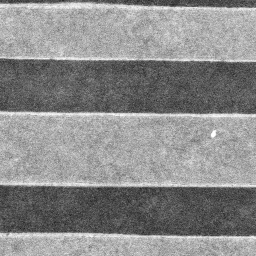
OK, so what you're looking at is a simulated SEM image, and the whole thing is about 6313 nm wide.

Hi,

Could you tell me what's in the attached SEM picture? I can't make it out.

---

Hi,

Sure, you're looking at lines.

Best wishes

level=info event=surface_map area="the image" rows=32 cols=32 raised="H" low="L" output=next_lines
LLLLLLLLLLLLLLLLLLLLLLLLLLLLLLLL
HHHHHHHHHHHHHHHHHHHHHHHHHHHHHHHH
HHHHHHHHHHHHHHHHHHHHHHHHHHHHHHHH
HHHHHHHHHHHHHHHHHHHHHHHHHHHHHHHH
HHHHHHHHHHHHHHHHHHHHHHHHHHHHHHHH
HHHHHHHHHHHHHHHHHHHHHHHHHHHHHHHH
HHHHHHHHHHHHHHHHHHHHHHHHHHHHHHHH
LLLLLLLLLLLLLLLLLLLLLLLLLLHHHHHH
LLLLLLLLLLLLLLLLLLLLLLLLLLLLLLLL
LLLLLLLLLLLLLLLLLLLLLLLLLLLLLLLL
LLLLLLLLLLLLLLLLLLLLLLLLLLLLLLLL
LLLLLLLLLLLLLLLLLLLLLLLLLLLLLLLL
LLLLLLLLLLLLLLLLLLLLLLLLLLLLLLLL
LLLLLLLLLLLLLLLLLLLLLLLLLLLLLLLL
HHHHHHHHHHHHHHHHHLLLLLLLLLLLLLLL
HHHHHHHHHHHHHHHHHHHHHHHHHHHHHHHH
HHHHHHHHHHHHHHHHHHHHHHHHHHHHHHHH
HHHHHHHHHHHHHHHHHHHHHHHHHHHHHHHH
HHHHHHHHHHHHHHHHHHHHHHHHHHHHHHHH
HHHHHHHHHHHHHHHHHHHHHHHHHHHHHHHH
HHHHHHHHHHHHHHHHHHHHHHHHHHHHHHHH
HHHHHHHHHHHHHHHHHHHHHHHHHHHHHHHH
HHHHHHHHHHHHHHHHHHHHHHHHHHHHHHHH
LLLLLLLLLLLLLLLLLLLLLLLLLLLLLLLL
LLLLLLLLLLLLLLLLLLLLLLLLLLLLLLLL
LLLLLLLLLLLLLLLLLLLLLLLLLLLLLLLL
LLLLLLLLLLLLLLLLLLLLLLLLLLLLLLLL
LLLLLLLLLLLLLLLLLLLLLLLLLLLLLLLL
LLLLLLLLLLLLLLLLLLLLLLLLLLLLLLLL
HHHLHHLLLLLLLLLLLLLLLLLLLLLLLLLL
HHHHHHHHHHHHHHHHHHHHHHHHHHHHHHHH
HHHHHHHHHHHHHHHHHHHHHHHHHHHHHHHH